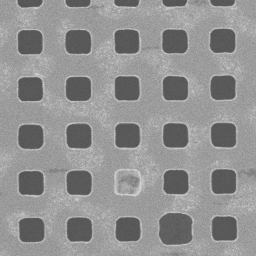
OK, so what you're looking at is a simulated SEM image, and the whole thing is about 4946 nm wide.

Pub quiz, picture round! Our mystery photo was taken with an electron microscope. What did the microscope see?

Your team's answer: a regular array of holes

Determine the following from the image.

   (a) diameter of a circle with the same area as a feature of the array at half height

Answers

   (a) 525 nm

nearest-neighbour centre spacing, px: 46.9